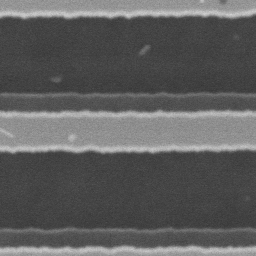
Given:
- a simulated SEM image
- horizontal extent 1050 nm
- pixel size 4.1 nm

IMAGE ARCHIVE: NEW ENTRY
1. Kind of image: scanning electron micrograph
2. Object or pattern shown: lines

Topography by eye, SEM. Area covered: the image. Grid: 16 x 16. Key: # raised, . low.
################
................
................
................
................
................
................
################
################
#...#.#.........
................
................
................
................
................
################